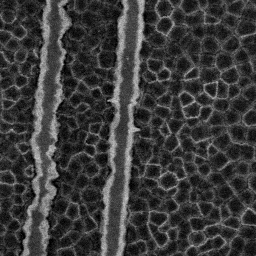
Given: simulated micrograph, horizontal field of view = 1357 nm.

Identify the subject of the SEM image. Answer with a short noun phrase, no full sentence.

one or a few lines or trenches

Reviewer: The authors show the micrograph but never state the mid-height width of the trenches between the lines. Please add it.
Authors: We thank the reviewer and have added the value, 59 px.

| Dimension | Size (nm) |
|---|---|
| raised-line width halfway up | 89.7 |